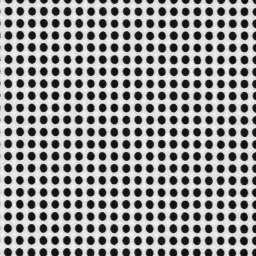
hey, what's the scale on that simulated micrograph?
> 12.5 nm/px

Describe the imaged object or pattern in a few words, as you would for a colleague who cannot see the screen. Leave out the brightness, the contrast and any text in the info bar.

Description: a regular array of holes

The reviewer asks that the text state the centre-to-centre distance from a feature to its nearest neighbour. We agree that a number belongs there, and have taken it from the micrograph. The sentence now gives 146 nanometers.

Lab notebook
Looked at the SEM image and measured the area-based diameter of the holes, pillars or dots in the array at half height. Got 0.102 microns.